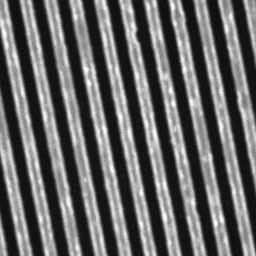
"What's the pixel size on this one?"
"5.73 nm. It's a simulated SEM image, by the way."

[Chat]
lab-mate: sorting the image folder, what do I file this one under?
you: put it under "parallel lines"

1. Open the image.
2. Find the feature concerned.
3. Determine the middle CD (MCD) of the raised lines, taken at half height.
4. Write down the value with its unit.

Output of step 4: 0.0605 microns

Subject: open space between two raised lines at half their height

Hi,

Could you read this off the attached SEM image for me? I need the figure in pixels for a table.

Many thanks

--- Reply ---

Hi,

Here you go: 14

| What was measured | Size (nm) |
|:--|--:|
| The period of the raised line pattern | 140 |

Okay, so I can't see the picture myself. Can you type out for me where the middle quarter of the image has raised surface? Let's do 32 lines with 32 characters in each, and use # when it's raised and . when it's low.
#....##....###...###...###....##
#....###...###...###....##....##
##...###...###....##....##....##
##...###....##....##....###...##
##....##....##....###...###....#
##....##....###...###...###....#
##....###...###...###....##....#
###...###...###....##....##....#
###...###...###....##....###...#
###...###....##....###...###...#
.##....##....###...###...###....
.##....###...###...###....##....
.##....###...###....##....##....
.###...###....##....##....###...
.###....##....##....###...###...
..##....##....###...###...###...
..##....###...###...###...###...
..##....###...###....##....##...
..###...###...###....##....###..
..###....##....##....###...###..
...##....##....###...###...###..
...##....###...###...###....##..
...##....###...###....##....##..
...###...###....##....##....###.
...###....##....##....###...###.
...###....##....###...###...###.
....##....##....###...###....##.
....##....###...###....##....##.
....###...###....##....##....###
#...###....##....##....##....###
#...###...###....###...###...###
#....##....##....###...###...###